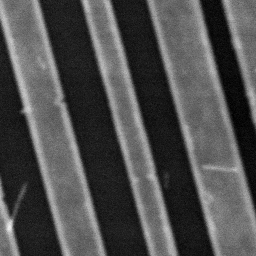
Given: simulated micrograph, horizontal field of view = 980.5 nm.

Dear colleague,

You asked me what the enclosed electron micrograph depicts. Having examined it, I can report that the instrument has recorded one or a few lines or trenches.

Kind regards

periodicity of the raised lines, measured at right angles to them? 290 nm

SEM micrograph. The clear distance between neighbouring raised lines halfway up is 0.157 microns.